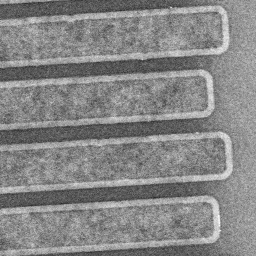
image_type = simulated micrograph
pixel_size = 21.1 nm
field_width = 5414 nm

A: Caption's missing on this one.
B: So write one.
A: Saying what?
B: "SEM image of one or a few lines or trenches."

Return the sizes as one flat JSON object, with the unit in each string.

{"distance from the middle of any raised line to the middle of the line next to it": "1330 nm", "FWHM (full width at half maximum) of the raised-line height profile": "0.918 micrometres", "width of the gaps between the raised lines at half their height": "420 nm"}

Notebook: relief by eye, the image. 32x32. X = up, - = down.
--------------------------------
-------------------XXXXXXXXX----
----XXXXXXXXXXXXXXXXXXXXXXXX----
XXXXXXXXXXXXXXXXXXXXXXXXXXXX----
XXXXXXXXXXXXXXXXXXXXXXXXXXXX----
XXXXXXXXXXXXXXXXXXXXXXXXXXXX----
XXXXXXXXXXXXXXXXXXXXXXXXXXX-----
XXXXXXXXXX----------------------
--------------------------------
-----------------XXXXXXXXX------
-XXXXXXXXXXXXXXXXXXXXXXXXX------
XXXXXXXXXXXXXXXXXXXXXXXXXX------
XXXXXXXXXXXXXXXXXXXXXXXXXX------
XXXXXXXXXXXXXXXXXXXXXXXXXX------
XXXXXXXXXXXXXXXXXXXXXXX---------
XXXXXXX-------------------------
--------------------------------
---------------XXXXXXXXXXXXX----
XXXXXXXXXXXXXXXXXXXXXXXXXXXXX---
XXXXXXXXXXXXXXXXXXXXXXXXXXXXX---
XXXXXXXXXXXXXXXXXXXXXXXXXXXXX---
XXXXXXXXXXXXXXXXXXXXXXXXXXXXX---
XXXXXXXXXXXXXXXXXXXXX-----------
XXXXXX--------------------------
--------------------------------
--------------XXXXXXXXXXXXX-----
XXXXXXXXXXXXXXXXXXXXXXXXXXX-----
XXXXXXXXXXXXXXXXXXXXXXXXXXX-----
XXXXXXXXXXXXXXXXXXXXXXXXXXX-----
XXXXXXXXXXXXXXXXXXXXXXXXXXX-----
XXXXXXXXXXXXXXXXXXXX------------
XXXX----------------------------